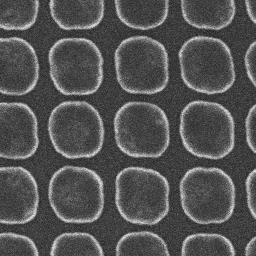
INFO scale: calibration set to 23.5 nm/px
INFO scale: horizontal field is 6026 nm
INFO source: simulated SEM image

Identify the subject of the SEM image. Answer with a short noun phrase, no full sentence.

a regular array of raised bodies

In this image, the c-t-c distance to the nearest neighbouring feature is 1520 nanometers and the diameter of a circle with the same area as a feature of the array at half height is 1.32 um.